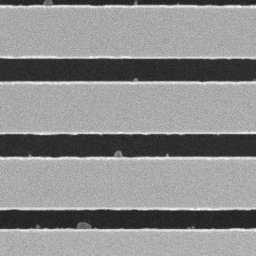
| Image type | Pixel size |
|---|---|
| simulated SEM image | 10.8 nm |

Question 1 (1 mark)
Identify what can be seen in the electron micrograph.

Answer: lines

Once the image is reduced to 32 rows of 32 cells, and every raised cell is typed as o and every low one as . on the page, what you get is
................................
oooooooooooooooooooooooooooooooo
oooooooooooooooooooooooooooooooo
oooooooooooooooooooooooooooooooo
oooooooooooooooooooooooooooooooo
oooooooooooooooooooooooooooooooo
oooooooooooooooooooooooooooooooo
................................
................................
................................
oooooooooooooooooooooooooooooooo
oooooooooooooooooooooooooooooooo
oooooooooooooooooooooooooooooooo
oooooooooooooooooooooooooooooooo
oooooooooooooooooooooooooooooooo
oooooooooooooooooooooooooooooooo
oooooooooooooooooooooooooooooooo
................................
................................
................................
oooooooooooooooooooooooooooooooo
oooooooooooooooooooooooooooooooo
oooooooooooooooooooooooooooooooo
oooooooooooooooooooooooooooooooo
oooooooooooooooooooooooooooooooo
oooooooooooooooooooooooooooooooo
................................
................................
................................
oooooooooooooooooooooooooooooooo
oooooooooooooooooooooooooooooooo
oooooooooooooooooooooooooooooooo